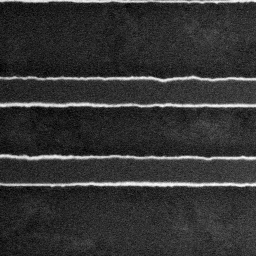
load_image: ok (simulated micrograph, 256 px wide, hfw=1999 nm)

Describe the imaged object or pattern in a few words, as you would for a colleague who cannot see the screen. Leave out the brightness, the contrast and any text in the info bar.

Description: lines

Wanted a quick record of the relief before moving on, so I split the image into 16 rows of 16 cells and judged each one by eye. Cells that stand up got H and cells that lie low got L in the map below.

LLLLLLLLLLLLLLLL
LLLLLLLLLLLLLLLL
LLLLLLLLLLLLLLLL
LLLLLLLLLLLLLLLL
LLLLLLLLLLLLLLLL
HHHHHHHHHHHHHHHH
HHHHHHHHHHHHHHHH
LLLLLLLLLLLLLLLL
LLLLLLLLLLLLLLLL
LLLLLLLLLLLLLLLL
HHHHHHHHHHHHHHHH
HHHHHHHHHHHHHHHH
LLLLLLLLLLLLLLLL
LLLLLLLLLLLLLLLL
LLLLLLLLLLLLLLLL
LLLLLLLLLLLLLLLL